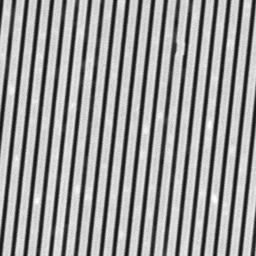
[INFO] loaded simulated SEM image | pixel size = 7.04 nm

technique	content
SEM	parallel lines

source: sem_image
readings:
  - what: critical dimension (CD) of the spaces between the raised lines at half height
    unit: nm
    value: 35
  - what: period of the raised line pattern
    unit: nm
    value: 88.5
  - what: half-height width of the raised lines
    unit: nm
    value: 53.5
